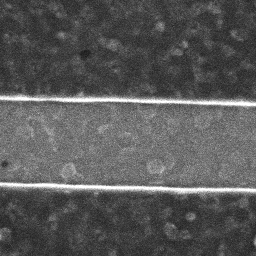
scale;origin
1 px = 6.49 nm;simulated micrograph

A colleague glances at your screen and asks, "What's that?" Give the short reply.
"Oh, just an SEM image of one or a few lines or trenches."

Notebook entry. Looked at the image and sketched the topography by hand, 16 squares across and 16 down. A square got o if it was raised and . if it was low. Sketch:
oooooooooooooooo
oooooooooooooooo
oooooooooooooooo
oooooooooooooooo
oooooooooooooooo
oooooooooooooooo
...............o
................
................
................
................
o...............
oooooooooooooooo
oooooooooooooooo
oooooooooooooooo
oooooooooooooooo